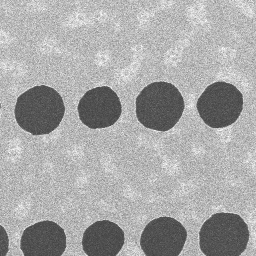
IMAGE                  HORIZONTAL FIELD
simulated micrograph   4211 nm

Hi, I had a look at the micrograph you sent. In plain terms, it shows holes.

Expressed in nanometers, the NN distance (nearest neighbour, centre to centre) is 988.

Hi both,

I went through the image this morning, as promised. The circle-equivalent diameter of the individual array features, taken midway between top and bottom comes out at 784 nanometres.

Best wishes